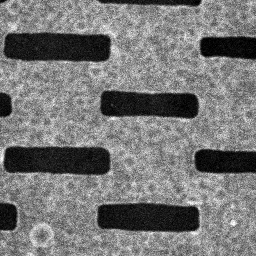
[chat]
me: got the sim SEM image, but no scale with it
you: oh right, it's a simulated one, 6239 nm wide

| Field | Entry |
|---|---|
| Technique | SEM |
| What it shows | holes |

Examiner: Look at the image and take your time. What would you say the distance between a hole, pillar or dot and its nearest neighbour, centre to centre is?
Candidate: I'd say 107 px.